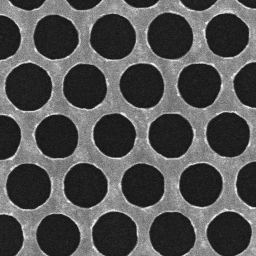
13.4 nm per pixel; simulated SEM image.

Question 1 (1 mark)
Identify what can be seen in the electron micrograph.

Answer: a regular array of holes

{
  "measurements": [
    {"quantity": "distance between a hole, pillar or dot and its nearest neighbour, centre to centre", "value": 761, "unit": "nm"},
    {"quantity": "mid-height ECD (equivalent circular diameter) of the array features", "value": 601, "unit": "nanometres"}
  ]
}